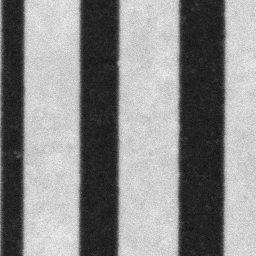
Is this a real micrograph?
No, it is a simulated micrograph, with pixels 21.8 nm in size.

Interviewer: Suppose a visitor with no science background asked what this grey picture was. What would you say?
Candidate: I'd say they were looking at one or a few lines or trenches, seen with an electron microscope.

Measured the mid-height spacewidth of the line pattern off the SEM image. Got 1250 nm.